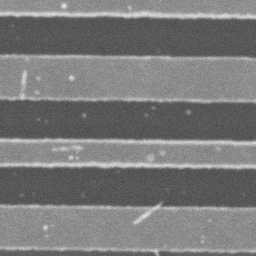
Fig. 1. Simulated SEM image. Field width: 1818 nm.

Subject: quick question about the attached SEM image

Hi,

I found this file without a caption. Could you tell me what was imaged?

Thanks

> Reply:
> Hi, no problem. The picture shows lines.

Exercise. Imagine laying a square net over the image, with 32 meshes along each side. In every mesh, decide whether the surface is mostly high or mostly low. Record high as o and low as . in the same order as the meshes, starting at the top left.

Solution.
oooooooooooooooooooooooooooooooo
oooooooooooooooooooooooooooooooo
................................
................................
................................
................................
................................
oooooooooooooooooooooooooooooooo
oooooooooooooooooooooooooooooooo
oooooooooooooooooooooooooooooooo
oooooooooooooooooooooooooooooooo
oooooooooooooooooooooooooooooooo
.......ooooo.o.ooooooooooooooooo
................................
................................
................................
................................
ooo..ooo........................
oooooooooooooooooooooooooooooooo
oooooooooooooooooooooooooooooooo
oooooooooooooooooooooooooooooooo
................................
................................
................................
................................
................................
oooooooooooooooooooooooooooooooo
oooooooooooooooooooooooooooooooo
oooooooooooooooooooooooooooooooo
oooooooooooooooooooooooooooooooo
oooooooooooooooooooooooooooooooo
...........................ooo.o